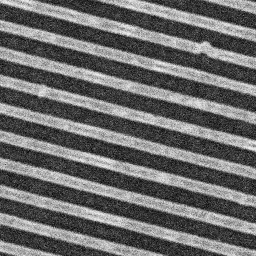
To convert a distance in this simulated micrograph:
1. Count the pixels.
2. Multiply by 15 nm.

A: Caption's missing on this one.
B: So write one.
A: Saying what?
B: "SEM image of parallel lines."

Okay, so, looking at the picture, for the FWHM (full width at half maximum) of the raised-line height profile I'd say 145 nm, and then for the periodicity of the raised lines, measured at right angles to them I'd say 0.401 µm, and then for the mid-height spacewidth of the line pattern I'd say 17.6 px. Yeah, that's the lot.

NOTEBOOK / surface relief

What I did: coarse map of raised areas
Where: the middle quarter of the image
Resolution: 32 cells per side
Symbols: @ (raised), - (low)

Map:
@------------------@@@@@@@@@@---
@@@@@------------------@@@@@@@@@
@@@@@@@@@------------------@@@@@
----@@@@@@@@@------------------@
-------@@@@@@@@@@---------------
------------@@@@@@@@@-----------
---------------@@@@@@@@@--------
@@------------------@@@@@@@@----
@@@@@@------------------@@@@@@@@
@@@@@@@@@@------------------@@@@
----@@@@@@@@@@-----------------@
--------@@@@@@@@@@--------------
------------@@@@@@@@------------
----------------@@@@@@@@--------
@@------------------@@@@@@@@----
@@@@@@------------------@@@@@@@@
@@@@@@@@@@-----------------@@@@@
----@@@@@@@@@@-----------------@
--------@@@@@@@@@---------------
------------@@@@@@@@@-----------
-----------------@@@@@@@@-------
@@------------------@@@@@@@@@---
@@@@@@@----------------@@@@@@@@@
-@@@@@@@@@------------------@@@@
-----@@@@@@@@@------------------
---------@@@@@@@@@--------------
-------------@@@@@@@@@----------
----------------@@@@@@@@@@------
@@@-----------------@@@@@@@@@@--
@@@@@@------------------@@@@@@@@
--@@@@@@@@------------------@@@@
-----@@@@@@@@@------------------